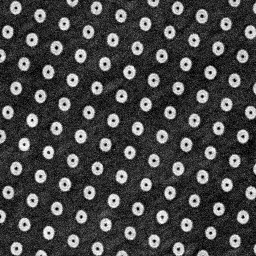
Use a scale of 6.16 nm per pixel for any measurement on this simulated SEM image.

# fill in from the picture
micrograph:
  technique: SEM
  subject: a regular array of ring-shaped raised bodies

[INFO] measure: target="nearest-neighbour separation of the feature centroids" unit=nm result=156